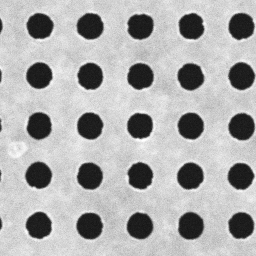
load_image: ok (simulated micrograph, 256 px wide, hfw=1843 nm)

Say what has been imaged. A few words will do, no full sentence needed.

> a regular array of holes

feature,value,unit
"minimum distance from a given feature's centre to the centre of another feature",357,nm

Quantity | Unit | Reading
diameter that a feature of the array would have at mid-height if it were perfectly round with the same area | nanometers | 194